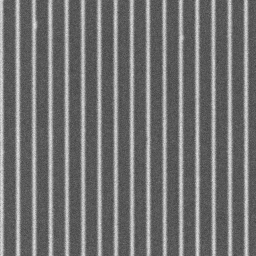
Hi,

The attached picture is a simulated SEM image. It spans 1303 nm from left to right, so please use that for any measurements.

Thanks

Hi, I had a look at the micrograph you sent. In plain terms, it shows parallel lines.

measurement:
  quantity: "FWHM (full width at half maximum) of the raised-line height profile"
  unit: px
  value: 3.38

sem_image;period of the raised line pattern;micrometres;0.083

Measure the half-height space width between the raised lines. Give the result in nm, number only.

68